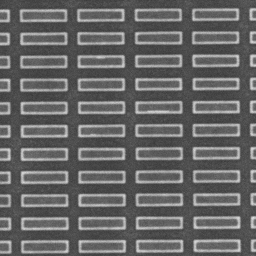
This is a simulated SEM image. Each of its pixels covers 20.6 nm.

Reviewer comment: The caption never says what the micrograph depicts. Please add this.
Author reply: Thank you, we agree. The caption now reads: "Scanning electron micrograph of groups of lines, slits or small figures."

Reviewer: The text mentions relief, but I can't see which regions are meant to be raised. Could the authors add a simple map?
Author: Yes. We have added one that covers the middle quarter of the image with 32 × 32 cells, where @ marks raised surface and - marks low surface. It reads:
----@@@@@@@@@@@-----------------
--------------------------------
--------------------------------
--------------------------------
@---@@@@@@@@@@@---@@@@@@@@@@@---
@---@@@@@@@@@@@---@@@@@@@@@@@---
--------------------------------
--------------------------------
--------------------------------
--------------------------------
@---@@@@@@@@@@@---@@@@@@@@@@@---
@---@@@@@@@@@@@---@@@@@@@@@@@---
--------------------------------
--------------------------------
--------------------------------
-----@@@@@@@@@@---@@@@@@@@@@@---
@---@@@@@@@@@@@---@@@@@@@@@@@---
@---@@@@@@@@@@@---@@@@@@@@@@@---
--------------------------------
--------------------------------
--------------------------------
@---@@@@@@@@@@@---@@@@@@@@@@@---
@---@@@@@@@@@@@---@@@@@@@@@@@---
@---@@@@@@@@@@@---@@@@@@@@@@@---
--------------------------------
--------------------------------
--------------------------------
@---@@@@@@@@@@@---@@@@@@@@@@@---
@---@@@@@@@@@@@---@@@@@@@@@@@---
@---@@@@@@----------------------
--------------------------------
--------------------------------